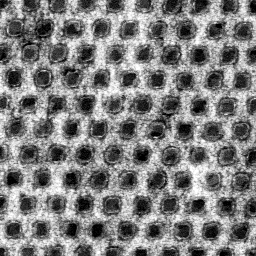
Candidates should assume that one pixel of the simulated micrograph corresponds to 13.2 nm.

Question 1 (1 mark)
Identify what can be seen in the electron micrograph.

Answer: a regular array of raised bodies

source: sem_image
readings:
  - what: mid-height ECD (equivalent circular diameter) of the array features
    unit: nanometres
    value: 204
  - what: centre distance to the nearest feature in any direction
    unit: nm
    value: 368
